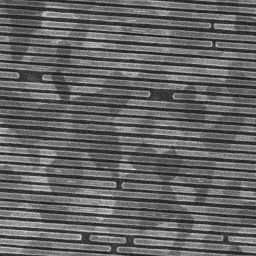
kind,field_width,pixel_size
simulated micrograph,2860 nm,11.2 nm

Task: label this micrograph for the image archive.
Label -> parallel lines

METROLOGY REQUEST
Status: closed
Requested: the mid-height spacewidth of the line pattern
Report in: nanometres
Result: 39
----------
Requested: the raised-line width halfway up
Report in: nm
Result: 58.5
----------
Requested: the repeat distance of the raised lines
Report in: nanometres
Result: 103